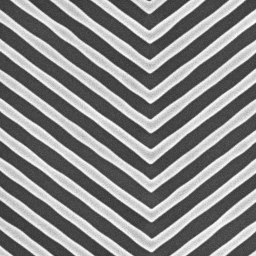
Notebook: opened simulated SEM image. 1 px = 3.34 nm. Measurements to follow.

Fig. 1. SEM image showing groups of lines, slits or small figures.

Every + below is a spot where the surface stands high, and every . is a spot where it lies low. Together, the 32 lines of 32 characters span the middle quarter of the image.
+++......++++......+++++......++
++++......+++++.....+++.....++++
..++++......++++...........++++.
...++++......++++.........++++..
....+++++.....+++++......++++...
......++++.....+++++...++++.....
+......++++......++++.++++......
+++.....+++++.....+++++++.....++
++++......++++......++++.....+++
.++++......++++......+......++++
..+++++.....+++++.........++++..
....++++......++++.......++++...
.....++++......++++.....++++....
.......++++.....+++++.+++++.....
++......++++......+++++++......+
+++......+++++.....+++++......++
+++++.....+++++......++......+++
..++++......++++...........++++.
...++++......++++.........++++..
....+++++.....+++++.....+++++...
......++++......++++...++++.....
+......++++......+++++++++......
+++.....+++++.....+++++++.....++
++++......++++......++++.....+++
..++++......+++......+......++++
...++++......++++..........++++.
....++++.......+++.......++++...
.....++++.......++++....++++....
+......++++......++++..++++.....
++......++++......+++++++......+
++++.....++++.......++++.....+++
.++++......++++......++.....++++